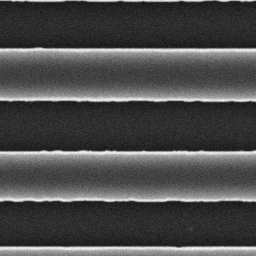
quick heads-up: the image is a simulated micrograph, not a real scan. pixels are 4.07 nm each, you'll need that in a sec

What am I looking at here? lines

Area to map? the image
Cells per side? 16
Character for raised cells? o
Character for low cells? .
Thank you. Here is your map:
................
................
................
oooooooooooooooo
oooooooooooooooo
oooooooooooooooo
................
................
................
...o............
oooooooooooooooo
oooooooooooooooo
oooooooooooooooo
................
................
oooo.oooooo.oooo